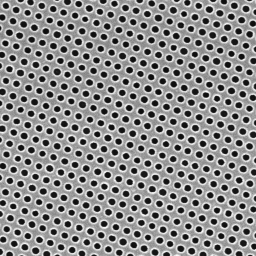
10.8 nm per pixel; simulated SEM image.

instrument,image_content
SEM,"a regular array of holes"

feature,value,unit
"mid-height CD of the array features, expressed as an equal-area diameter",70.9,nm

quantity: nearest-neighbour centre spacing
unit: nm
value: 120